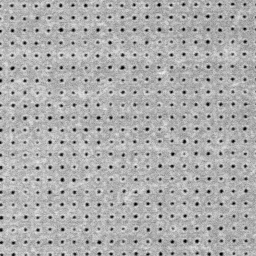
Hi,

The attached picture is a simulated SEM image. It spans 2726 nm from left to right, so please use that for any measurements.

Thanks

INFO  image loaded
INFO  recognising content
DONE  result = a regular array of holes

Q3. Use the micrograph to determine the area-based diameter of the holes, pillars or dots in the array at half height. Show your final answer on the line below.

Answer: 45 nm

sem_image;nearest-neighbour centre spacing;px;12